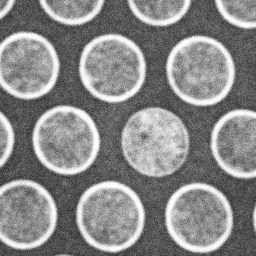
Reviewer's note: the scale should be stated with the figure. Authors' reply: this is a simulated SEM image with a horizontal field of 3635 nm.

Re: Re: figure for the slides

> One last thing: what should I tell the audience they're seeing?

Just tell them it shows raised bodies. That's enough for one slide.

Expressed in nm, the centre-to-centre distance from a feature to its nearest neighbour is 1250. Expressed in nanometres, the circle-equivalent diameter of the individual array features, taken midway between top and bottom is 898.